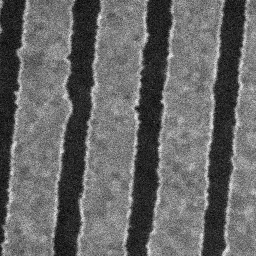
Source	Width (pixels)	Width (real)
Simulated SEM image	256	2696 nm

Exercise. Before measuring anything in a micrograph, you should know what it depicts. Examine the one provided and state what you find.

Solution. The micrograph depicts one or a few lines or trenches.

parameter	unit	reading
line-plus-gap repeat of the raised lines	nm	774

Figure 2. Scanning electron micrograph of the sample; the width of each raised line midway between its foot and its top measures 0.502 micrometres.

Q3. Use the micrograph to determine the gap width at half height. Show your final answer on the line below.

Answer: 266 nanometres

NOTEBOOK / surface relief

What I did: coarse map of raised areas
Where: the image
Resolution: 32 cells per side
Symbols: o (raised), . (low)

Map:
...oooooo....ooooo....oooooo...o
...oooooo....ooooo....oooooo...o
...oooooo...oooooo....oooooo...o
...oooooo...oooooo....ooooo....o
...oooooo...oooooo...oooooo....o
...oooooo...oooooo...oooooo....o
..ooooooo...oooooo...oooooo...oo
...ooooo....oooooo...oooooo...oo
...oooooo...oooooo...oooooo...oo
..oooooo....ooooo....oooooo...oo
..oooooo....ooooo....oooooo...oo
..oooooo....ooooo...oooooo....oo
..ooooooo...ooooo...ooooooo...oo
..ooooooo...ooooo....oooooo...oo
..ooooooo..oooooo...ooooooo...oo
..oooooo...oooooo...oooooo....oo
..oooooo...oooooo...oooooo...ooo
..oooooo...oooooo...oooooo...ooo
..oooooo...oooooo...oooooo...ooo
.ooooooo...oooooo...oooooo...ooo
.ooooooo...oooooo...oooooo...ooo
.oooooo....oooooo...oooooo...ooo
.oooooo....oooooo...oooooo...ooo
.oooooo....ooooo....oooooo...ooo
.oooooo...oooooo....oooooo...ooo
.oooooo...oooooo....oooooo...ooo
.oooooo...oooooo...ooooooo..oooo
.oooooo...oooooo...oooooo...oooo
.oooooo...oooooo...oooooo...oooo
.oooooo...oooooo...oooooo...oooo
.oooooo...oooooo...oooooo...oooo
ooooooo...oooooo...oooooo...oooo